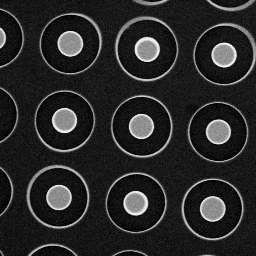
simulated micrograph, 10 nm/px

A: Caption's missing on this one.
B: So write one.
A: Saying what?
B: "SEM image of an array of small figures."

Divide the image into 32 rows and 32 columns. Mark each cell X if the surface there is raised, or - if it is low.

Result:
XXXXXXXXXXXXXXXXXXXXXXXXXXX----X
-XXXXXXXXXXXXXXXXXXXXXXXXXXXXXXX
--XXXXX----XXXXXX--XXXXXXXXXXXXX
---XXX------XXXX-----XXXXXX---XX
X--XX---XX--XXX-------XXX------X
---XX--XXX---XX--XXX--XXX--XX---
--XXX---XX--XXX--XXX--XX---XX---
--XXXX------XXX---X---XX---XX---
XXXXXXX----XXXX------XXXX------X
XXXXXXXXXXXXXXXXX---XXXXX------X
XXXXXXXXXXXXXXXXXXXXXXXXXXXXXXXX
-XXXXXXX-XXXXXXXXXXXXXXXXXXXXXXX
--XXXX-----XXXXX---XXXXXXXXXXXXX
--XXX------XXXX------XXXX----XXX
--XXX--XX---XX---X---XXX------XX
--XX---XX---XX--XXX--XXX--XX---X
-XXXX------XXX--XXX--XXX--XXX--X
XXXXX------XXX-------XXX--XX---X
XXXXXXX--XXXXXX-----XXXX------XX
XXXXXXXXXXXXXXXXX-XXXXXXX----XXX
XXXXXXXXXXXXXXXXXXXXXXXXXXXXXXXX
-XXXX----XXXXXXXXXXXXXXXXXXXXXXX
-XXX------XXXXX----XXXXXXX-XXXXX
-XXX--XX---XXX------XXXX-----XXX
-XXX--XXX--XXX--XX---XX-------XX
-XXX--XXX--XX---XX---XX--XXX--XX
XXXX-------XXX--XX--XXX--XXX--XX
XXXXX-----XXXX------XXX---X---XX
XXXXXXXXXXXXXXX----XXXXX-----XXX
XXXXXXXXXXXXXXXXXXXXXXXXX---XXXX
XXXXXXXXXXXXXXXXXXXXXXXXXXXXXXXX
XXXX-----XXXXXX--XXXXXXXXXXXXXXX